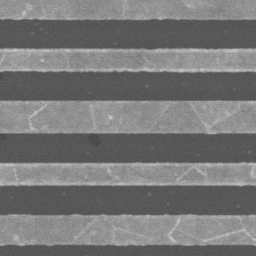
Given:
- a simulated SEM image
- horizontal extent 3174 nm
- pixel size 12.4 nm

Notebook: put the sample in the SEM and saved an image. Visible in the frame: lines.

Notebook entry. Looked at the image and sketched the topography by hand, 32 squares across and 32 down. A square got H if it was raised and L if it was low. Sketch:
HHHHHHHHHHHHHHHHHHHHHHHHHHHHHHHH
HHHHHHHHHHHHHHHHHHHHHHHHHHHHHHHH
LLLLLLLLLLLLLLLLLLLLLLLLLLLLLLLL
LLLLLLLLLLLLLLLLLLLLLLLLLLLLLLLL
LLLLLLLLLLLLLLLLLLLLLLLLLLLLLLLL
LLLLLLLLLLLLLLLLLLLLLLLLLLLLLLLL
HHHHHHHHHHHHHHHHHHHHHHHHHHHHHHHH
HHHHHHHHHHHHHHHHHHHHHHHHHHHHHHHH
HHHHHHHHHHHHHHHHHHHHHHHHHHHHHHHH
LLLLLLLLLLLLLLLLLLLLLLLLLLLLLLLL
LLLLLLLLLLLLLLLLLLLLLLLLLLLLLLLL
LLLLLLLLLLLLLLLLLLLLLLLLLLLLLLLL
LLLLLLLLLLLLLLLLLLLLLLLLLLLLLLLL
HHHHHHHHHHHHHHHHHHHHHHHHHHHHHHHH
HHHHHHHHHHHHHHHHHHHHHHHHHHHHHHHH
HHHHHHHHHHHHHHHHHHHHHHHHHHHHHHHH
HHHHHHHHHHHHHHHHHHHHHHHHHHHHHHHH
LLLLLLLLLLLLLLLLLLLLLLLLLLLLLLLL
LLLLLLLLLLLLLLLLLLLLLLLLLLLLLLLL
LLLLLLLLLLLLLLLLLLLLLLLLLLLLLLLL
HLHHHHHHHHHHHHHHHHHHHHHHHHHHHHHH
HHHHHHHHHHHHHHHHHHHHHHHHHHHHHHHH
HHHHHHHHHHHHHHHHHHHHHHHHHHHHHHHH
LLLLLLLLLLLLLLLLLLLLLLLLLLLLLLLL
LLLLLLLLLLLLLLLLLLLLLLLLLLLLLLLL
LLLLLLLLLLLLLLLLLLLLLLLLLLLLLLLL
LLLLLLLLLLLLLLLLLLLLLLLLLLLLLLLL
HHHHHHHHHHHHHHHHHHHHHHHHHHHHHHHH
HHHHHHHHHHHHHHHHHHHHHHHHHHHHHHHH
HHHHHHHHHHHHHHHHHHHHHHHHHHHHHHHH
HHHHHHHHHHHHHHHHHHHHHHHHHHHHHHHH
LLLLLLLLLLLLLLLLLLLLLLLLLLLLLLLL